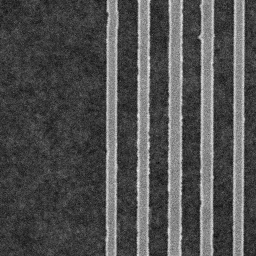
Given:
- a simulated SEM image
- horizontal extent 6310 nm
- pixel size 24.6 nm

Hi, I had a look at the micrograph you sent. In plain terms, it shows parallel lines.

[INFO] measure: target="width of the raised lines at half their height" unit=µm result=0.259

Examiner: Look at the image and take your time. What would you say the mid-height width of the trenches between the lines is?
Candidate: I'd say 21.3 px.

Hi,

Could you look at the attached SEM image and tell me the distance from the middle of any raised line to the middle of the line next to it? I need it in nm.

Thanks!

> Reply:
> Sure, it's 783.